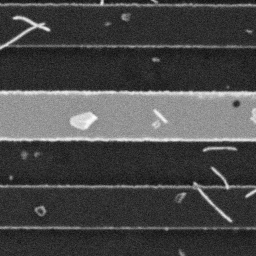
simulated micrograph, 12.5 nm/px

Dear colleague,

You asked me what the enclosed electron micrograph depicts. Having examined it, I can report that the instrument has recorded lines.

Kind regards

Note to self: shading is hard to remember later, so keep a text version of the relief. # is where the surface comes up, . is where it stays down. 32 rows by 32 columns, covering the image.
............#...................
################################
################################
################################
################################
################################
................................
................................
................................
................................
................................
#.#...###....#..................
################################
################################
################################
################################
################################
......#.......#..#.##..##.##.##.
................................
................................
................................
................................
................................
################################
################################
################################
################################
################################
################################
................................
................................
................................